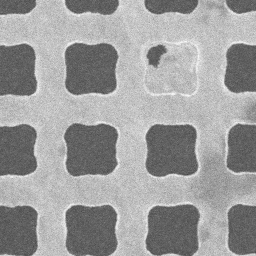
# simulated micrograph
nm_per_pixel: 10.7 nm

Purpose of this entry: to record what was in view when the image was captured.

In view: holes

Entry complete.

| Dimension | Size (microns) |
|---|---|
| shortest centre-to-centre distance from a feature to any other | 0.859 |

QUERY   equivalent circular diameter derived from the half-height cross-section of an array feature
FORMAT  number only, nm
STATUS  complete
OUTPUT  613